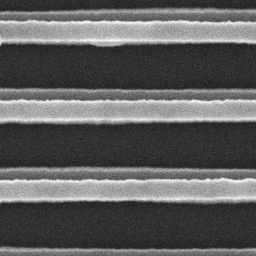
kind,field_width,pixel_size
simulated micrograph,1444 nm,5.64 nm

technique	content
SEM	lines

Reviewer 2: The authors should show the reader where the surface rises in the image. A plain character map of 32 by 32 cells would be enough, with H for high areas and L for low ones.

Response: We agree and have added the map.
LLLLLLLLLLLLLLLLLLLLLLLLLLLLLLLL
LLLLLLLLLLHLHHLHLHHHHHHHHHHHHHHH
HHHHHHHHHHHHHHHHHHHHHHHHHHHHHHHH
HHHHHHHHHHHHHHHHHHHHHHHHHHHHHHHH
HHHHHHHHHHHHHHHHHHHHHHHHHHHHHHHH
LLLLLLLLLLLHHHHLLLLLLLLLLLLLLLLL
LLLLLLLLLLLLLLLLLLLLLLLLLLLLLLLL
LLLLLLLLLLLLLLLLLLLLLLLLLLLLLLLL
LLLLLLLLLLLLLLLLLLLLLLLLLLLLLLLL
LLLLLLLLLLLLLLLLLLLLLLLLLLLLLLLL
LLLLLLLLLLLLLLLLLLLLLLLLLLLLLLLL
HHHHHHHHHHHHHHHHHHHHHHHHHHHHHHHH
HHHHHHHHHHHHHHHHHHHHHHHHHHHHHHHH
HHHHHHHHHHHHHHHHHHHHHHHHHHHHHHHH
HHHHHHHHHHHHHHHHHHHHHHHHHHHHHHHH
LLLLLLLLLLLLLLLLLLLLLLLLLLLLLLLL
LLLLLLLLLLLLLLLLLLLLLLLLLLLLLLLL
LLLLLLLLLLLLLLLLLLLLLLLLLLLLLLLL
LLLLLLLLLLLLLLLLLLLLLLLLLLLLLLLL
LLLLLLLLLLLLLLLLLLLLLLLLLLLLLLLL
LLLLLLLLLLLLLLLLLLLLLLLLLLLLLLLL
HHHHHHHHHHHHHHHHHHHHHHHHHHHHHHHH
HHHHHHHHHHHHHHHHHHHHHHHHHHHHHHHH
HHHHHHHHHHHHHHHHHHHHHHHHHHHHHHHH
HHHHHHHHHHHHHHHHHHHHHHHHHHHHHHHH
LLLLLLLLLLLLLLLLLLLLLLLLLLLLLLLL
LLLLLLLLLLLLLLLLLLLLLLLLLLLLLLLL
LLLLLLLLLLLLLLLLLLLLLLLLLLLLLLLL
LLLLLLLLLLLLLLLLLLLLLLLLLLLLLLLL
LLLLLLLLLLLLLLLLLLLLLLLLLLLLLLLL
LLLLLLLLLLLLLLLLLLLLLLLLLLLLLLLL
HHHHHHHHHHHHHHHHHHHHHHHHHHHHHHHH